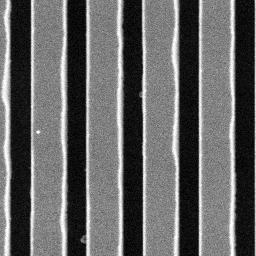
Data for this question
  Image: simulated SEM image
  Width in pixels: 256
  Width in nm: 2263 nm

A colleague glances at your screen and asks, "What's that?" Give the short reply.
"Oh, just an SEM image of lines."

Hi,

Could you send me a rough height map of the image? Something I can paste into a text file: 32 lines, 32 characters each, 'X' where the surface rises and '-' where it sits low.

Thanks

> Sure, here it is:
X---XXXX---XXXX---XXXX---XXXX---
X---XXXX---XXXX---XXXX---XXXX---
X---XXXX---XXXX---XXXX---XXXX---
X---XXXX---XXXX---XXXX---XXXX---
X---XXXX---XXXX---XXXX---XXXX---
X---XXXX---XXXX---XXXX---XXXX---
X---XXXX---XXXX---XXXX---XXXX---
X---XXXX---XXXX---XXXX---XXXX---
X---XXXX---XXXX---XXXX---XXXX---
X---XXXX---XXXX---XXXX---XXXX---
X---XXXX---XXXX---XXXX---XXXX---
X---XXXX---XXXX---XXXX---XXXX---
X---XXXX---XXXX---XXXX---XXXX---
X---XXXX---XXXX---XXXX---XXXX---
X---XXXX---XXXX---XXXX---XXXX---
X---XXXX---XXXX---XXXX---XXXX---
X---XXXX---XXXX---XXXX---XXXX---
X---XXXX---XXXX---XXXX---XXXX---
X---XXXX---XXXX---XXXX---XXXX---
X---XXXX---XXXX---XXXX---XXXX---
X---XXXX---XXXX---XXXX---XXXX---
X---XXXX---XXXX---XXXX---XXXX---
X---XXXX---XXXX---XXXX---XXXX---
X---XXXX---XXXX---XXXX---XXXX---
X---XXXX---XXXX---XXXX---XXXX---
X---XXXX---XXXX---XXXX---XXXX---
X---XXXX---XXXX---XXXX---XXXX---
X---XXXX---XXXX---XXXX---XXXX---
X---XXXX---XXXX---XXXX---XXXX---
X---XXXX---XXXX---XXXX---XXXX---
X---XXXX---XXXX---XXXX---XXXX---
X---XXXX---XXXX---XXXX---XXXX---